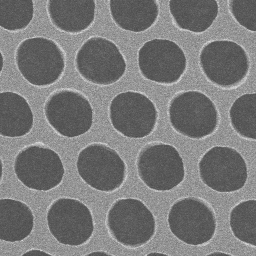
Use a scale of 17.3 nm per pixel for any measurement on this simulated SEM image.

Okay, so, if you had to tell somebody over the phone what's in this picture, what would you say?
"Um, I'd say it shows a regular array of holes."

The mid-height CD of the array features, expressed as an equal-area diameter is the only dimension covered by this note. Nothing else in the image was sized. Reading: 0.806 microns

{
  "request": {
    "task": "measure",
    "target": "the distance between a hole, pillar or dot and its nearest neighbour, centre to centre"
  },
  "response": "1.05 µm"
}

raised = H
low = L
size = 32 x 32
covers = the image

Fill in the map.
LLLLHHLLLLLLHHLLLLLHHLLLLLLHHLLL
LLLLHHLLLLLLHHLLLLLLHLLLLLLHHLLL
LLLLHHLLLLLLHHLLLLLHHHLLLLLHHHLL
HLLHHHHLLLLHHHHLLLLHHHHLLLHHHHHL
HHHHHHHHHHHHHHHHHHHHHHHHHHHHHHHH
HHHLLLLHHHHLLLHHHHLLLLHHHHLLLLHH
HHLLLLLLHHLLLLLHHLLLLLLHHLLLLLLH
HHLLLLLLHHLLLLLLHLLLLLLHHLLLLLLH
HHLLLLLLHHLLLLLLHHLLLLLHHLLLLLLH
HHHLLLLHHHLLLLLHHHLLLLLHHHLLLLHH
HHHHLLHHHHHHLLHHHHHHHHHHHHHLLHHH
HHHHHHHHLHHHHHHHHHHHHHHLLHHHHHHH
LLLHHHLLLLLHHHLLLLLHHHLLLLHHHLLL
LLLLHHLLLLLHHHLLLLLHHLLLLLLHHLLL
LLLLHHLLLLLLHHLLLLLLHLLLLLLHHLLL
LLLLHHLLLLLHHHLLLLLHHLLLLLLHHLLL
LLLLHHHLLLLHHHHLLLLHHHHLLLHHHHLL
HHHHHHHHHHHHHHHHHHHHHHHHHHHHHHHH
HHHLLHHHHHHLLLHHHHLLLLHHHHHLLHHH
HHLLLLLHHHLLLLLHHLLLLLLHHLLLLLHH
HHLLLLLLHHLLLLLLHLLLLLLHHLLLLLLH
HHLLLLLLHHLLLLLLHLLLLLLHHLLLLLLH
HHLLLLLLHHLLLLLHHHLLLLLHHLLLLLLH
HHHHLLLHHHHHLLLHHHHLLLHHHHLLLLHH
HHHHHHHHHHHHHHHHHHHHHHHHHHHHHHHH
LLLHHHHLLLHHHHLLLLHHHHLLLHHHHHLL
LLLLHHLLLLLHHHLLLLLHHLLLLLHHHLLL
LLLLHHLLLLLLHHLLLLLHHLLLLLLHHLLL
LLLLHHLLLLLLHHLLLLLHHLLLLLLHHLLL
LLLHHHHLLLLHHHLLLLLHHHLLLLHHHLLL
HHHHHHHHLLHHHHHHLLHHHHHLLHHHHHHL
HHHLLHHHHHHHHHHHHHHHHHHHHHHHHHHH